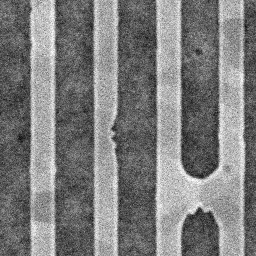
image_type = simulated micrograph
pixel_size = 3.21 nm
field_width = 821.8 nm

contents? one or a few lines or trenches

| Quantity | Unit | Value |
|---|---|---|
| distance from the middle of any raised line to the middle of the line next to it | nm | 202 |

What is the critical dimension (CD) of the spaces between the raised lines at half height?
134 nanometres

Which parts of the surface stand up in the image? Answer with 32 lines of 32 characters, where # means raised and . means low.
....###.....##......##......##..
....###.....##......##......##..
....###.....###.....##......##..
....###.....##......##......##..
....###.....##......##......##..
....###.....##......##......##..
....###.....##......##......##..
....###.....##......##......##..
....###.....##......##......##..
....###.....##......##......##..
....###.....##......##......##..
....###.....##......##......##..
....###.....##......##......##..
....###.....##......##......##..
....###.....##......##......##..
....###.....##......##......##..
....###.....##......##......##..
....###.....##......##.....###..
....###.....##......##......##..
....###.....##......##......##..
....###.....###.....###.....##..
....###.....###.....###....###..
....###.....###.....#####.####..
....###.....###.....##########..
....###.....###.....##########..
....###.....###.....##########..
....###.....###.....####...###..
....###.....###.....###....###..
....###.....###.....###.....##..
....###.....###.....##......##..
....###.....###.....##......##..
....###.....###.....##......##..